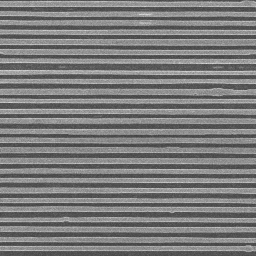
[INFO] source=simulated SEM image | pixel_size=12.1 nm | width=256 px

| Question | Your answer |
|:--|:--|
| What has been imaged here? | parallel lines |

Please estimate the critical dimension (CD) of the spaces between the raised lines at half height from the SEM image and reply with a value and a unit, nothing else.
59.1 nm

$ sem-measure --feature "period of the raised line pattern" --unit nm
119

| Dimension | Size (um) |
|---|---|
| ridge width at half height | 0.0576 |